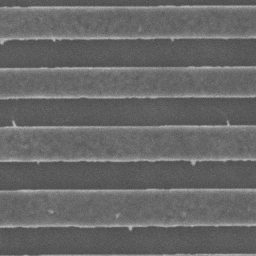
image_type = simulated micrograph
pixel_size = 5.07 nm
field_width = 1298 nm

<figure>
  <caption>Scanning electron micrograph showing lines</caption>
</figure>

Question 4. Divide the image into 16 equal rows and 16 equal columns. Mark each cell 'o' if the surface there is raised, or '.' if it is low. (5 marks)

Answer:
oooooooooooooooo
oooooooooooooooo
................
................
oooooooooooooooo
oooooooooooooooo
................
................
oooooooooooooooo
oooooooooooooooo
................
................
oooooooooooooooo
oooooooooooooooo
................
................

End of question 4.